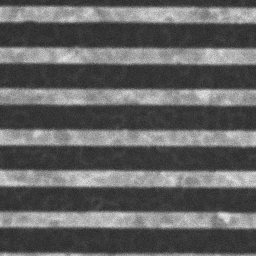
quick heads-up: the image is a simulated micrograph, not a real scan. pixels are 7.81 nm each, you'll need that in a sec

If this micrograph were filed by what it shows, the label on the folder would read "parallel lines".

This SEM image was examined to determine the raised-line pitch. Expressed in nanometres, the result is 321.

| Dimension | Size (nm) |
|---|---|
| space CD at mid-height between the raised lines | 211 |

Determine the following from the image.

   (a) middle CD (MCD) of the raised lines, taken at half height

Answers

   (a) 111 nanometers